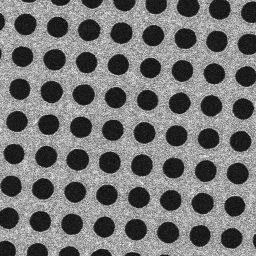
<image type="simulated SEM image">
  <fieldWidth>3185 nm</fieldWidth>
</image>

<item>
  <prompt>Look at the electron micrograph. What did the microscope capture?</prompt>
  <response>a regular array of holes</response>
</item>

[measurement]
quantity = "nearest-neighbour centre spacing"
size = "0.397 µm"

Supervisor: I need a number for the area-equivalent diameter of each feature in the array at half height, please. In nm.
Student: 269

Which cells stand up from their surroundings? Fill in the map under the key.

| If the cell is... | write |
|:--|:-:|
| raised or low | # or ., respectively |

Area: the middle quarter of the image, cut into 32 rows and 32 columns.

###.....###.....###.....###.....
####....###.....###.....###.....
############...####.....###.....
#####################.######....
################################
####...#########################
##.....####....#####..##########
##......##.....####....#####...#
##......##......##.....####....#
###....###.....###......##......
###########....###.....###......
####################..#####....#
############################.###
###...##########################
##.....###....#####.############
#......###.....###....#####..###
##.....##......##......###.....#
##.....###.....##......##......#
####.#####....###......##......#
###################...####....##
###########################..###
##...###########################
#.....####...###################
#.....###.....###.....####..####
#.....###.....###.....###.....##
#.....###.....###.....###.....##
##...#####....###.....###.....##
##################...####.....##
##########################..####
##.#############################
#....####...####################
......##.....####....######.####